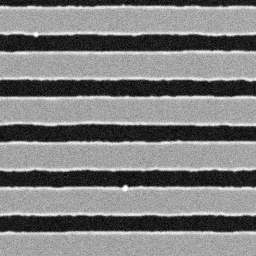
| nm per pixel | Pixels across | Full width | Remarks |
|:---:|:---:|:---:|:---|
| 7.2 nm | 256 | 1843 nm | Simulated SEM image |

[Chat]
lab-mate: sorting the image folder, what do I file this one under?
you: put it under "lines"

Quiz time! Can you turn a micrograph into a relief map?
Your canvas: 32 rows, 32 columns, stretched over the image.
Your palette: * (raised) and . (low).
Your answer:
................................
********************************
********************************
********************************
................................
................................
......................******.**.
********************************
********************************
********************************
................................
................................
********************************
********************************
********************************
**..******....******************
................................
................................
********************************
********************************
********************************
................................
................................
********************************
********************************
********************************
********************************
................................
................................
********************************
********************************
********************************